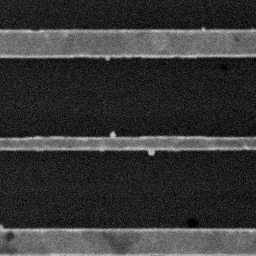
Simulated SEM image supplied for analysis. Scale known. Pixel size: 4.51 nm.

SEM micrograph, lines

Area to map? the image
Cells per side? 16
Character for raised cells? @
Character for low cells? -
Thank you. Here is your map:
----------------
----------------
@@@@@@@@@@@@@@@@
@@@@@@@@@@@@@@@@
----------------
----------------
----------------
----------------
----------------
----------------
----------------
----------------
----------------
----------------
@@@@@@@@@@@@@@@@
@@@@@@@@@@@@@@@@